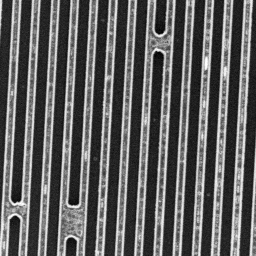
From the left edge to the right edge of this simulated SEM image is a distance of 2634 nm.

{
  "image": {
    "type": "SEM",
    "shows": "parallel lines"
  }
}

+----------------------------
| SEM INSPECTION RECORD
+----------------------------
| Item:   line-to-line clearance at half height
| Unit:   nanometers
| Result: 126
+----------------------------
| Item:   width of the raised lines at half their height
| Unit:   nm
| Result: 71.9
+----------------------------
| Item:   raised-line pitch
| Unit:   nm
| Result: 198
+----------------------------